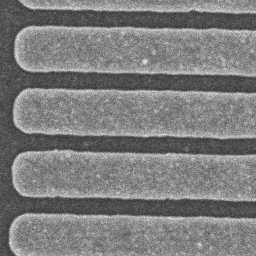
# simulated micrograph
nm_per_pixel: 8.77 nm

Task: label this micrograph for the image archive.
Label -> parallel lines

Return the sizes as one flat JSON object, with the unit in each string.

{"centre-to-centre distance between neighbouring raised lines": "549 nanometres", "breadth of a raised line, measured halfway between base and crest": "389 nm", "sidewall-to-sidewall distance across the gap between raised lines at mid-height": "0.159 µm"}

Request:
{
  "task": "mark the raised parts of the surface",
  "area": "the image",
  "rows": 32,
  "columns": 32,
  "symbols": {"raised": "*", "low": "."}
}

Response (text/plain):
...*****************************
.............................***
................................
...*******.*..**................
..******************************
..******************************
..******************************
..******************************
...*****************************
................................
................................
...*******************..**......
..******************************
..******************************
..******************************
..******************************
...*****************************
................................
................................
..***************************..*
..******************************
..******************************
..******************************
..******************************
...****.************************
................................
................................
..******************************
.*******************************
.*******************************
.*******************************
..******************************